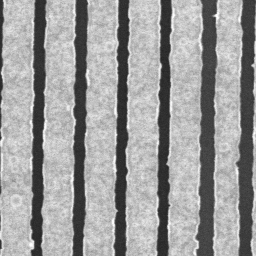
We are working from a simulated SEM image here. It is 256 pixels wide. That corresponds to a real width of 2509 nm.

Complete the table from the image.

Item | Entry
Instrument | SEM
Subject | parallel lines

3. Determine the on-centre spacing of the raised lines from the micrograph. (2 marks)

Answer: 412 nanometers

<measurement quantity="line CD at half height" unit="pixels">31.1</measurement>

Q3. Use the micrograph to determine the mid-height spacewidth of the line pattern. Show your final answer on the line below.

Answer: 114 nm